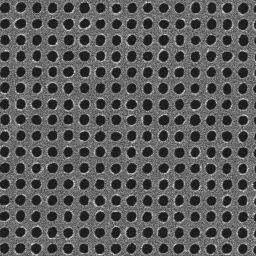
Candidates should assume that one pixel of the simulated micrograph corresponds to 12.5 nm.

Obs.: a regular array of holes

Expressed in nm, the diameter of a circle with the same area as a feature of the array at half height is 128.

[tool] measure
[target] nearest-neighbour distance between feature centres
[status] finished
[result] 0.196 um